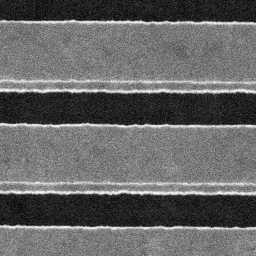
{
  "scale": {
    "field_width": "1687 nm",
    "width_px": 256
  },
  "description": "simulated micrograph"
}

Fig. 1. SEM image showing lines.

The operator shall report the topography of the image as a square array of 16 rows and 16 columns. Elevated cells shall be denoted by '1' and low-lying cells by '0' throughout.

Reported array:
0000000000000000
1111111111111111
1111111111111111
1111111111111111
1111111111111111
1111111111111111
0000000000000000
0000000000000000
1111111111111111
1111111111111111
1111111111111111
1111111111111111
0000000000000000
0000000000000000
1111111111111111
1111111111111111